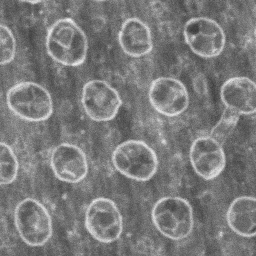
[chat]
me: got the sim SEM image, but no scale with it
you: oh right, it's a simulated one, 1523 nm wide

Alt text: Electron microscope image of a regular array of raised bodies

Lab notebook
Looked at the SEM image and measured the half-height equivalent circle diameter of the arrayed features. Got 230 nanometers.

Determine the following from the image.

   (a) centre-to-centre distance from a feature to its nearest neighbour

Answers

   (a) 401 nanometers